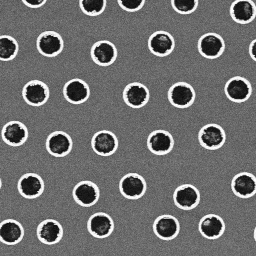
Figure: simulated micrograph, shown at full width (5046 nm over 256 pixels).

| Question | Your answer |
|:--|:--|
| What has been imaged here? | a regular array of raised bodies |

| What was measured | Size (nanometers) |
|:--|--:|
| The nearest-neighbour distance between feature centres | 897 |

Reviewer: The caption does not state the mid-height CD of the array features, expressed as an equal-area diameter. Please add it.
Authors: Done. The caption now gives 473 nm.